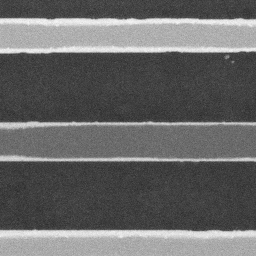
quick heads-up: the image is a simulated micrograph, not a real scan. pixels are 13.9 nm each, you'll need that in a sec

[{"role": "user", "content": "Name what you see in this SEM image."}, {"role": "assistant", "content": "lines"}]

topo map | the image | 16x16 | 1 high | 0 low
0000000000000000
1111111111111111
1111111111111111
0000000000000000
0000000000000000
0000000000000000
0000000000000000
0000000000000000
1111111111111111
1111111111111111
0000000000000000
0000000000000000
0000000000000000
0000000000000000
1111111111111111
1111111111111111